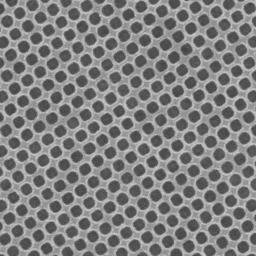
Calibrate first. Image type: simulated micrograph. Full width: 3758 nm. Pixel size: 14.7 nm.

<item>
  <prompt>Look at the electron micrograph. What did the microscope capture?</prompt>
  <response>a regular array of holes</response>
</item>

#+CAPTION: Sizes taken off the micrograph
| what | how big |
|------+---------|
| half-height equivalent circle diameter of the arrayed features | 186 nm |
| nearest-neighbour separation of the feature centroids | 219 nm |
